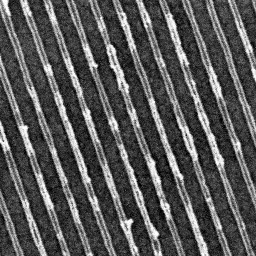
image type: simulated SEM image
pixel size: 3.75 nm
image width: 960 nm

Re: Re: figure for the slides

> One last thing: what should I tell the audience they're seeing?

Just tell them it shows parallel lines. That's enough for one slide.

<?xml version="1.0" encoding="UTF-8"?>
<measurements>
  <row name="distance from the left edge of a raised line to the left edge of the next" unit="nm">81.8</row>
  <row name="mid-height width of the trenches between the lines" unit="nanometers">62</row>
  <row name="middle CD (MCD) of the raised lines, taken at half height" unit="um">0.0217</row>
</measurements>